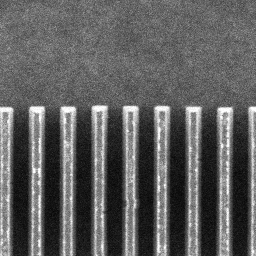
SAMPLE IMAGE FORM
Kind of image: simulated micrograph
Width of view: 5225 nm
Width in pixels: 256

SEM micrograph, parallel lines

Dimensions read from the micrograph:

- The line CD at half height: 217 nanometres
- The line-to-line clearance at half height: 0.416 micrometres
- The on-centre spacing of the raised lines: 640 nm